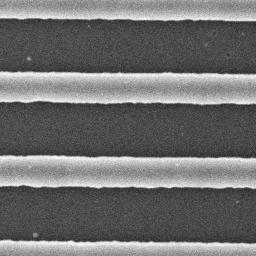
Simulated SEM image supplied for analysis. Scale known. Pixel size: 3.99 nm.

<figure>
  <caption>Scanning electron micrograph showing lines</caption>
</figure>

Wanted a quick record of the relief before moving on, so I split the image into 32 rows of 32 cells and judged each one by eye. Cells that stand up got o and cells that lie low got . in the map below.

oooooooooooooooooooooooooooooooo
oooooooooooooooooooooooooooooooo
....................o.o.....oooo
................................
................................
................................
................................
................................
................................
oooooooooooooooooooooooooooooooo
oooooooooooooooooooooooooooooooo
oooooooooooooooooooooooooooooooo
oooooooooooooooooooooooooooooooo
................................
................................
................................
................................
................................
................................
................................
oooooooooooooooooooooooooooooooo
oooooooooooooooooooooooooooooooo
oooooooooooooooooooooooooooooooo
................................
................................
................................
................................
................................
................................
................................
oooooooooooooooooooooooooooooooo
oooooooooooooooooooooooooooooooo